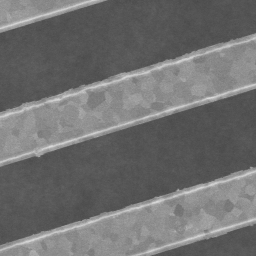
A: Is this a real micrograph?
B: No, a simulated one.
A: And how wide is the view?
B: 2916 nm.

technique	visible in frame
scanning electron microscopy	one or a few lines or trenches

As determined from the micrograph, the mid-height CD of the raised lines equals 0.504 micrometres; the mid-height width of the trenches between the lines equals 953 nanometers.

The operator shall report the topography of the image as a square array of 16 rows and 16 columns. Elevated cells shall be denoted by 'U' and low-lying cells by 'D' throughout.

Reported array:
UUUUDDDDDDDDDDDD
UDDDDDDDDDDDDDDD
DDDDDDDDDDDDDDDD
DDDDDDDDDDDDUUUU
DDDDDDDDDUUUUUUU
DDDDDDUUUUUUUUUD
DDDUUUUUUUUUDDDD
UUUUUUUUUDDDDDDD
UUUUUDDDDDDDDDDD
UUDDDDDDDDDDDDDD
DDDDDDDDDDDDDDDD
DDDDDDDDDDDDDUUU
DDDDDDDDDDUUUUUU
DDDDDDDUUUUUUUUU
DDDDUUUUUUUUUDDD
UUUUUUUUUUDDDDDD